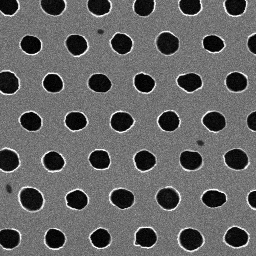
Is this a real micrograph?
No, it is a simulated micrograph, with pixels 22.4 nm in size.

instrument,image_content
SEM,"a regular array of holes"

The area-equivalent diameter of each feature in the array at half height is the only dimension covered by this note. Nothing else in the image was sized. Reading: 461 nanometers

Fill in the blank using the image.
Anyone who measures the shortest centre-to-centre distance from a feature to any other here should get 44.2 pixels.